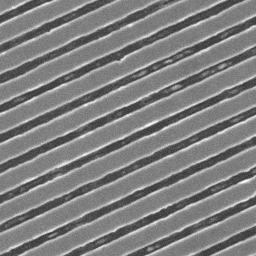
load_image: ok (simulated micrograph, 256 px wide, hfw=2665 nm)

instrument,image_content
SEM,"parallel lines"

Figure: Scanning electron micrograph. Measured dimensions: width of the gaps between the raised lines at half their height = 0.091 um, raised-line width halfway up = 18.5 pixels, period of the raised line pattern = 283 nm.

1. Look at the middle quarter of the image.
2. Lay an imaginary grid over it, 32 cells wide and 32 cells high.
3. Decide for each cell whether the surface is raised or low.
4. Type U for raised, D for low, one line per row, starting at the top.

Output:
UUUUUDDDDDUUUUUUUUUUUDDDDDUUUUUU
UUDDDDDUUUUUUUUUUUUDDDDDUUUUUUUU
DDDDDDUUUUUUUUUUDDDDDDUUUUUUUUUU
DDDDUUUUUUUUUUDDDDDDUUUUUUUUUUDD
DUUUUUUUUUUUDDDDDUUUUUUUUUUUDDDD
UUUUUUUUUUDDDDDUUUUUUUUUUUDDDDDU
UUUUUUUUDDDDDUUUUUUUUUUUDDDDDUUU
UUUUUUDDDDDUUUUUUUUUUUDDDDDUUUUU
UUUDDDDDDUUUUUUUUUUUDDDDDUUUUUUU
UDDDDDDUUUUUUUUUUUDDDDDUUUUUUUUU
DDDDUUUUUUUUUUUUDDDDDUUUUUUUUUUU
DDUUUUUUUUUUUDDDDDUUUUUUUUUUUUDD
UUUUUUUUUUUDDDDDUUUUUUUUUUUUDDDD
UUUUUUUUUDDDDDUUUUUUUUUUUUDDDDUU
UUUUUUUDDDDDUUUUUUUUUUUDDDDDUUUU
UUUUDDDDDDUUUUUUUUUUUDDDDDUUUUUU
UUUDDDDDUUUUUUUUUUUDDDDDUUUUUUUU
UDDDDUUUUUUUUUUUUDDDDDUUUUUUUUUU
DDDUUUUUUUUUUUUDDDDDUUUUUUUUUUUD
DUUUUUUUUUUUUDDDDUUUUUUUUUUUUDDD
UUUUUUUUUUDDDDDUUUUUUUUUUUDDDDDU
UUUUUUUUDDDDDUUUUUUUUUUUDDDDDUUU
UUUUUUDDDDDUUUUUUUUUUUDDDDDUUUUU
UUUUDDDDDUUUUUUUUUUDDDDDDUUUUUUU
UUDDDDDUUUUUUUUUUUDDDDDUUUUUUUUU
DDDDDUUUUUUUUUUUDDDDDUUUUUUUUUUU
DDUUUUUUUUUUUDDDDDUUUUUUUUUUUUDD
DUUUUUUUUUUDDDDDUUUUUUUUUUUUDDDD
UUUUUUUUUDDDDDUUUUUUUUUUUDDDDDDU
UUUUUUUDDDDDUUUUUUUUUUUDDDDDDUUU
UUUUDDDDDDUUUUUUUUUUUDDDDDUUUUUU
UUUDDDDDUUUUUUUUUUUDDDDDUUUUUUUU